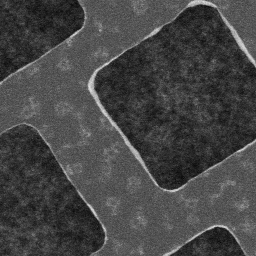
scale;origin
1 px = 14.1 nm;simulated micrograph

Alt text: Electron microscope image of holes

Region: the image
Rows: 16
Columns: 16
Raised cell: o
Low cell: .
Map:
.....ooooooo.ooo
.....ooooo....oo
....ooooo......o
...oooo........o
.ooooo..........
oooooo..........
oooooo..........
ooooooo.........
...ooooo........
...ooooo.......o
....ooooo....ooo
.....ooooo..oooo
.....ooooooooooo
......oooooooooo
......ooooooo.oo
......ooooo....o